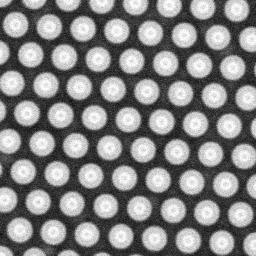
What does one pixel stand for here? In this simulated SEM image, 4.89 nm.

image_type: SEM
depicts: an array of small figures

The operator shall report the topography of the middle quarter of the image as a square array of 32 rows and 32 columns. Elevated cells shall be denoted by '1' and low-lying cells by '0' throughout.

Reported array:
11000011111000111111001111110001
00000001110000011110000111110001
00000000000000000000000011100000
00111100000110000000000000000000
01111110001111100001111000001100
01111110011111100011111000011111
01111110011111100011111100111111
01111100011111100011111100111111
00111000001111000011111000111111
00000000000000000001110000011110
10000001000000000000000000000000
11000111110000111100000010000000
11000111110001111110001111100001
11000111111001111110011111100011
11000111110001111110011111100011
10000111110001111110001111100011
00000000000000111100001111100011
00110000000000000000000000000001
11111000001110000001000000000000
11111100011111000111110000111100
11111100111111000111111000111110
11111100111111000111111001111110
01111000011111000111111001111110
00000000001110000011110000111110
00000000000000000000000000111100
10000111000000000000000000000000
10001111100001111000001110000000
10001111110011111100011111000011
10001111110011111100011111000111
00001111100011111100011111000111
00000111000001111000011111000111
00000000000000000000001110000011